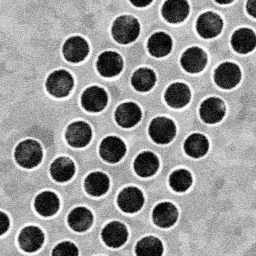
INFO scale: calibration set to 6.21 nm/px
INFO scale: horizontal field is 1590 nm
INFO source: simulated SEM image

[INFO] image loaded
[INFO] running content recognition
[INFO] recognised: a regular array of holes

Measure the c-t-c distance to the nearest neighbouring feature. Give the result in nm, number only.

231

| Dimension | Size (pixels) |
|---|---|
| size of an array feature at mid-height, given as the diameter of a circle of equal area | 29.8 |